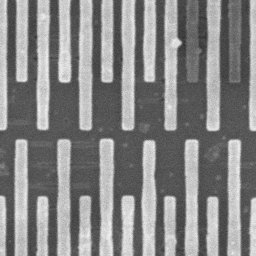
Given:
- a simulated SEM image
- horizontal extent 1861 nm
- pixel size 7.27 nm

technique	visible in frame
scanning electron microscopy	wiring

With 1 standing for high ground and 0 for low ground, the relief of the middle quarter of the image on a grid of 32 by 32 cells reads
10001110011100011000110000110001
10001110011100011000010000110001
10001110011100011000010000110001
10001110011100011000110000110001
00001110000000011000000000110000
00001110000000011000000000110000
00001110000000011000000000110000
00001110000000011000000000110000
00001110000000011000000000110000
00001110000000011000000001110000
00001110000000011000000001110000
00001110000000011000000001110000
00001110000000011000000001110000
00001110000000011000000000110000
00001110000000011000000000110000
00001110000000011000000000110000
00000000000000000000000000000000
00000000000000000000000000000000
00000000000000000000000000000000
10000000011100000000110000000001
10000000011100000000111000000011
10000000011100000000111000000011
10000000011100000000111000000011
10000000011100000000111000000011
10000000011100000000111000000011
10000000011100000000110000000011
10000000011100000000110000000011
10000000011100000000110000000001
10000000011100000000110000000001
10000000011100000000110000000001
10000000011100000000111000000001
10000000011100000000111000000001